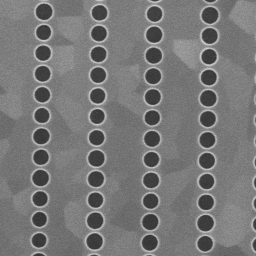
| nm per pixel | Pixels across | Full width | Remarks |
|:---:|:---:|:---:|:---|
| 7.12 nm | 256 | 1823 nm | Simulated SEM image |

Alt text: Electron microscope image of a regular array of holes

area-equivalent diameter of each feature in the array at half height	116	nanometres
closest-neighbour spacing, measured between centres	147	nm